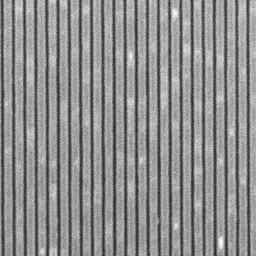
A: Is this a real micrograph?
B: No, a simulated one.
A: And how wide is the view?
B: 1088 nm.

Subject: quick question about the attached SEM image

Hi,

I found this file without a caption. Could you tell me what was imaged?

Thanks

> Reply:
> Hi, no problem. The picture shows parallel lines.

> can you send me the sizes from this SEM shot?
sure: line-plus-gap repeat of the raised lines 47.5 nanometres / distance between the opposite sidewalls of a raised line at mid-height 34.6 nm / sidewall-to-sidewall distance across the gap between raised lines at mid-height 15.4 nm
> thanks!